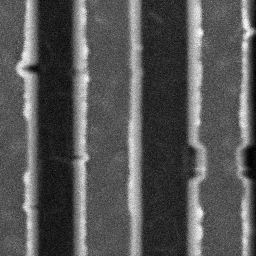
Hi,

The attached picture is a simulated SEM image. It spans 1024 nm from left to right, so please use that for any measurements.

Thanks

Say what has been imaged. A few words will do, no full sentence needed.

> one or a few lines or trenches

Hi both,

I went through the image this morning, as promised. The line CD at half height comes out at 241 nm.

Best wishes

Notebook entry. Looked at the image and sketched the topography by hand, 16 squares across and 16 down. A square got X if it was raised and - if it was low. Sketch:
XX---XXXX---XXXX
XX---XXXX---XXXX
XX---XXXX---XXXX
XX---XXXX---XXXX
XX---XXXX---XXXX
XX---XXXX---XXXX
XX---XXXX---XXXX
XX---XXXX---XXXX
XX---XXXX---XXXX
XX---XXXX---XXX-
XX---XXXX---XXX-
XX---XXXX---XXXX
XX---XXXX---XXXX
XX---XXXX---XXXX
XX---XXXX---XXXX
XX---XXXX---XXXX